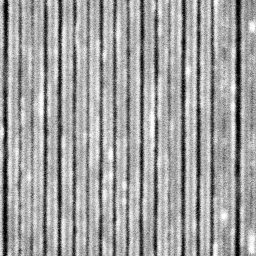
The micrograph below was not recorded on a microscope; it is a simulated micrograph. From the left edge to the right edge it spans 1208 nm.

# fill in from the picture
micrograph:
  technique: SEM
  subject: parallel lines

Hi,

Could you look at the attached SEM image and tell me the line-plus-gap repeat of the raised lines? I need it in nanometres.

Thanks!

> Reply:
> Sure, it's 64.6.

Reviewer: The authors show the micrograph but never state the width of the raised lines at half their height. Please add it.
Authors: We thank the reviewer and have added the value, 43.1 nm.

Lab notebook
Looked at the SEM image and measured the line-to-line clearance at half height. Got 21.8 nm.